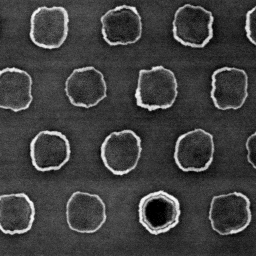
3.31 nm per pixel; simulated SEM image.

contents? a regular array of raised bodies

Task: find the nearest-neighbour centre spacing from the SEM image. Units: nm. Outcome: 236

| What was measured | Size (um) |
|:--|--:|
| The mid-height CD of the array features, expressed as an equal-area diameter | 0.134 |